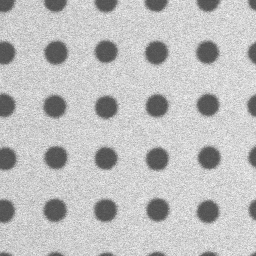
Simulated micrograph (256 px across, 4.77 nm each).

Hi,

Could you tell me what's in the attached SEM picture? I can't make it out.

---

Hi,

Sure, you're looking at a regular array of holes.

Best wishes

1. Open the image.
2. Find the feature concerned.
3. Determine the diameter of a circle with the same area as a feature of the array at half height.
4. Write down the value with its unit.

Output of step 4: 109 nm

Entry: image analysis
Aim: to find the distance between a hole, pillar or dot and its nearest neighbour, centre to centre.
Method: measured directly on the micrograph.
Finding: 50.8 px